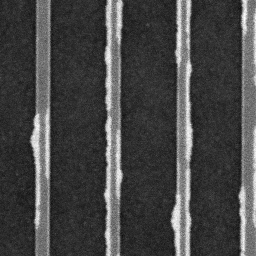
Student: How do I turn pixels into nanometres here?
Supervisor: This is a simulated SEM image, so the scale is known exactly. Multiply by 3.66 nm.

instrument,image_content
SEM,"one or a few lines or trenches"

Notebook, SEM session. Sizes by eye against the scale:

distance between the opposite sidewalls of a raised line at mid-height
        0.0476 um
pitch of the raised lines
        70.5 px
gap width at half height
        204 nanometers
